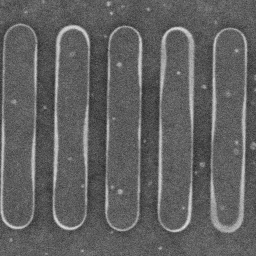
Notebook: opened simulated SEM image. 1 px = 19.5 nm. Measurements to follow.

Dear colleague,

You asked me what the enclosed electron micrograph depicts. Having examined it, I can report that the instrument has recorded groups of lines, slits or small figures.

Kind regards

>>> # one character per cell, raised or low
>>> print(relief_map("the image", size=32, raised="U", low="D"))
DDDDDDDDDDDDDDDDDDDDDDDDDDDDDDDD
DDDDDDDDDDDDDDDDDDDDDDDDDDDDDDDD
DDDDDDDDDDDDDDDDDDDDDDDDDDDDDDDD
DUUUDDDDDUDDDDDUDDDDDDDDDDDDDDDD
DUUUDDDUUUUDDDUUUDDDDUUUDDDUUUDD
UUUUUDDUUUUDDDUUUUDDUUUUDDDUUUUD
UUUUUDDUUUUDDDUUUUDDUUUUDDDUUUUD
UUUUDDDUUUUDDDUUUDDDUUUUDDDUUUUD
UUUUDDDUUUUDDDUUUDDDUUUUDDDUUUUD
UUUUDDDUUUUDDDUUUDDDUUUUDDDUUUUD
UUUUDDDUUUUDDDUUUUDDUUUUDDDUUUUD
UUUUDDDUUUUDDDUUUUDDUUUUDDDUUUUD
UUUUDDDUUUUDDDUUUUDDUUUUDDDUUUUD
UUUUDDDUUUUDDDUUUUDDUUUUDDDUUUUD
UUUUDDDUUUUDDDUUUDDDUUUUDDDUUUDD
UUUUDDDUUUUDDDUUUDDDUUUUDDDUUUDD
UUUUDDDUUUUDDDUUUDDDUUUUDDDUUUDD
UUUUDDDUUUUDDUUUUDDDUUUUDDDUUUUD
UUUUDDDUUUUDDUUUUDDDUUUUDDUUUUUD
UUUUDDDUUUUDDUUUUDDDUUUUDDUUUUUD
UUUUDDDUUUUDDUUUUDDDUUUUDDUUUUDD
UUUUDDDUUUUDDUUUUDDDUUUUDDUUUUDD
UUUUDDDUUUUDDUUUUDDDUUUUDDUUUUDD
UUUUDDDUUUUDDUUUUDDDUUUUDDUUUUDD
UUUUDDDUUUUDDUUUUDDDUUUUDDDUUUDD
UUUUDDDUUUUDDUUUUDDDUUUUDDDUUUDD
UUUUDDDUUUUDDUUUUDDDUUUUDDDUUUDD
UUUUDDDUUUUDDUUUUDDDUUUUDDDUUUDD
DDDDDDDDDDDDDDUUDDDDDUUDDDDDUDDD
DDDDDDDDDDDDDDDDDDDDDDDDDDDDDDDD
DDDDDDDDDDDDDDDDDDDDDDDDDDDDDDDD
DDDDDDDDDDDDDDDDDDDDDDDDDDDDDDDD